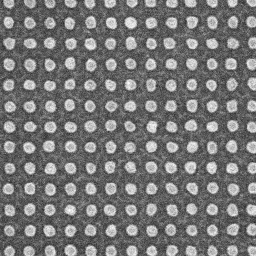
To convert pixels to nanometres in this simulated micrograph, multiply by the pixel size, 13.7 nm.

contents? a regular array of raised bodies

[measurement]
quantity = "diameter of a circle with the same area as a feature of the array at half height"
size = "142 nanometres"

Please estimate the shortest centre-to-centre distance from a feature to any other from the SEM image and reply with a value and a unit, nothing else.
271 nanometers